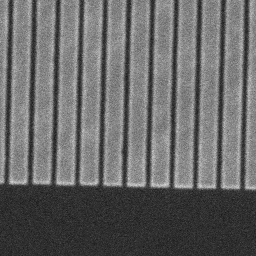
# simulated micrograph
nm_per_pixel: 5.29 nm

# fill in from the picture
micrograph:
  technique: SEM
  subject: parallel lines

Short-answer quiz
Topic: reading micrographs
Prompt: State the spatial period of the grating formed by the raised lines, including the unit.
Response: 125 nanometers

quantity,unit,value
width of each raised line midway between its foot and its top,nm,89.3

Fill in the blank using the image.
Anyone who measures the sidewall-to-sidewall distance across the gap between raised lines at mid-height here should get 31.7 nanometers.